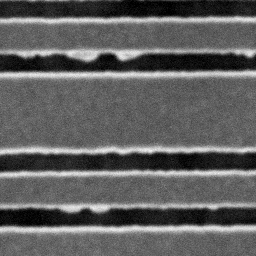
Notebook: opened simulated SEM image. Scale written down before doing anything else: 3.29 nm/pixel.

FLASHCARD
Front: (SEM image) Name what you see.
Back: lines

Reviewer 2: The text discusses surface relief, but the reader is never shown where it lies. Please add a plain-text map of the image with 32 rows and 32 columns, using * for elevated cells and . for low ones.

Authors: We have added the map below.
................................
................................
********************************
********************************
********************************
********************************
********************************
................................
................................
********************************
********************************
********************************
********************************
********************************
********************************
********************************
********************************
********************************
********************************
................................
................................
......*.**.*********************
********************************
********************************
********************************
********************************
................................
................................
******.*************************
********************************
********************************
********************************